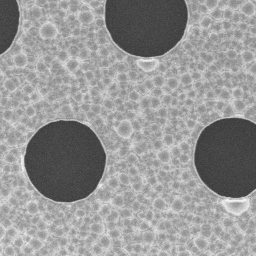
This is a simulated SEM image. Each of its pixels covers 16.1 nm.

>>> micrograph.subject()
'holes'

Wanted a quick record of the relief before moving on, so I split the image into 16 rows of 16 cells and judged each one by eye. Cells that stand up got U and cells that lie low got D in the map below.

DUUUUUUDDDDDUUUU
DUUUUUUDDDDDUUUU
DUUUUUUDDDDUUUUU
UUUUUUUUUDUUUUUU
UUUUUUUUUUUUUUUU
UUUUUUUUUUUUUUUU
UUUUUUUUUUUUUUUU
UUUUUUUUUUUUUUDU
UUDDDDUUUUUUDDDD
UUDDDDDUUUUUDDDD
UUDDDDDUUUUUDDDD
UUDDDDUUUUUUUDDD
UUUDDUUUUUUUUUUU
UUUUUUUUUUUUUUUU
UUUUUUUUUUUUUUUU
UUUUUUUUUUUUUUUU